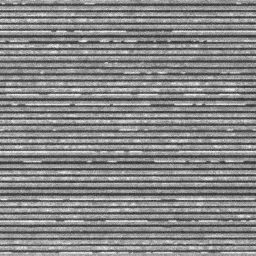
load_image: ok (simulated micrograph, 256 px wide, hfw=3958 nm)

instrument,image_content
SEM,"parallel lines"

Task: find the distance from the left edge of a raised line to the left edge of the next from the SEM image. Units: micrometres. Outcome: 0.0979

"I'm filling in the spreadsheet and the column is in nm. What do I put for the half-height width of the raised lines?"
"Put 48.3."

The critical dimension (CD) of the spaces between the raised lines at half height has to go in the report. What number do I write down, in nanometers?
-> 48.3